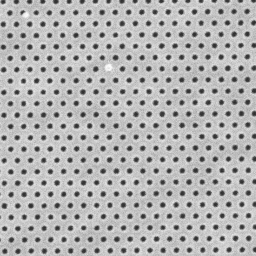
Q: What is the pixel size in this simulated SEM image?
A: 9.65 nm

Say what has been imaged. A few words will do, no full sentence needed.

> a regular array of holes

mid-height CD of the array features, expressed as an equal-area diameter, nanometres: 56.6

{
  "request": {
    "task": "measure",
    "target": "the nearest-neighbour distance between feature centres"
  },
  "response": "125 nanometers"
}